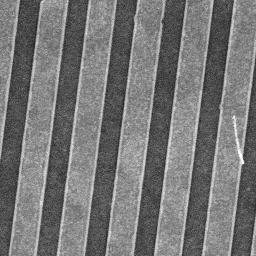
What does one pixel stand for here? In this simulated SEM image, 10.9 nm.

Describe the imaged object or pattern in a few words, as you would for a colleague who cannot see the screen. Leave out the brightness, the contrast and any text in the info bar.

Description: parallel lines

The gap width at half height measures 244 nm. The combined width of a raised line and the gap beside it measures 48.1 pixels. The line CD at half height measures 284 nm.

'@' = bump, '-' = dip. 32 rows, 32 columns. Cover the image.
@@---@@@---@@@---@@@---@@@@--@@@
@@---@@@---@@@---@@@---@@@---@@@
@@---@@@---@@@---@@@---@@@---@@@
@@---@@@---@@@---@@@---@@@---@@@
@@---@@@---@@@---@@@---@@@---@@@
@@---@@@---@@@---@@@---@@@---@@@
@@--@@@@--@@@@--@@@@---@@@---@@@
@---@@@---@@@@--@@@@--@@@@--@@@@
@---@@@---@@@---@@@---@@@@--@@@@
@---@@@---@@@---@@@---@@@---@@@-
@---@@@---@@@---@@@---@@@---@@@-
@---@@@---@@@---@@@---@@@---@@@-
@---@@@---@@@---@@@---@@@---@@@-
@---@@@---@@@---@@@---@@@---@@@-
@--@@@@--@@@@--@@@@---@@@---@@@-
---@@@@--@@@---@@@@--@@@@---@@@-
---@@@---@@@---@@@---@@@@--@@@@-
---@@@---@@@---@@@---@@@---@@@@-
---@@@---@@@---@@@---@@@---@@@--
---@@@---@@@---@@@---@@@---@@@--
---@@@---@@@---@@@---@@@---@@@--
---@@@---@@@---@@@---@@@---@@@--
--@@@@--@@@@---@@@---@@@---@@@--
--@@@---@@@---@@@@--@@@@---@@@--
--@@@---@@@---@@@---@@@@--@@@@--
--@@@---@@@---@@@---@@@---@@@@--
--@@@---@@@---@@@---@@@---@@@---
--@@@---@@@---@@@---@@@---@@@---
--@@@---@@@---@@@---@@@---@@@---
--@@@---@@@---@@@---@@@---@@@---
-@@@@--@@@@--@@@@---@@@---@@@---
-@@@@--@@@---@@@@--@@@@---@@@--@